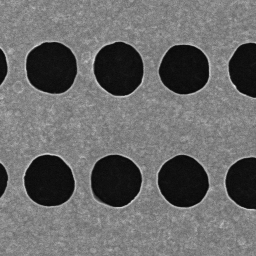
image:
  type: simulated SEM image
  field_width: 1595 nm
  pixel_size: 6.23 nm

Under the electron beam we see holes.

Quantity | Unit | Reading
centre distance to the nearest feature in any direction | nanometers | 415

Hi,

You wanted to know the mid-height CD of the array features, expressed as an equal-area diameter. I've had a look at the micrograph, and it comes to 51.4 px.